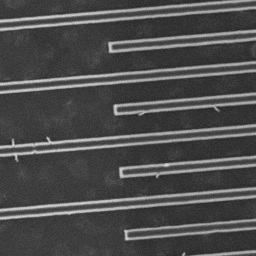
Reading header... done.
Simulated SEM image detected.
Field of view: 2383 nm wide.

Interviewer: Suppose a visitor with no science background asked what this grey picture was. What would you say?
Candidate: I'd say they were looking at parallel lines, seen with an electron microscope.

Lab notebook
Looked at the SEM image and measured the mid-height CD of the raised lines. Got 8.46 px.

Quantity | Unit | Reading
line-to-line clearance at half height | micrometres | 0.211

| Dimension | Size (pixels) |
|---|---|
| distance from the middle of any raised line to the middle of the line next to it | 31.4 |